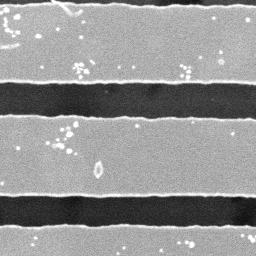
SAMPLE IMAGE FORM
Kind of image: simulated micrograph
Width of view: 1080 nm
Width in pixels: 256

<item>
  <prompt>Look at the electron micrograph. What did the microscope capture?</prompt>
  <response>lines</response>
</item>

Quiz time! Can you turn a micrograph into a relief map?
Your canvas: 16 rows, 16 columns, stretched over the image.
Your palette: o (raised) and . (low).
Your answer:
oooooooooooooooo
oooooooooooooooo
oooooooooooooooo
oooooooooooooooo
oooooooooooooooo
................
................
oooooooooooooooo
oooooooooooooooo
oooooooooooooooo
oooooooooooooooo
oooooooooooooooo
................
................
oooooooooooooooo
oooooooooooooooo